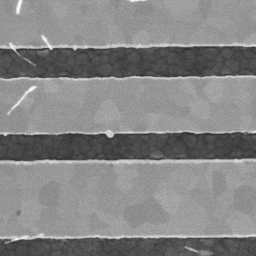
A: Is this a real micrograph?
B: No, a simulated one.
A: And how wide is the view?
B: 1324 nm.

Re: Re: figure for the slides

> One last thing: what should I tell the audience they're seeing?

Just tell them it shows lines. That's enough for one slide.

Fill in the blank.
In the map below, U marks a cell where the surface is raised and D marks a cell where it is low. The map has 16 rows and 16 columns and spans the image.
UUUUUUUUUUUUUUUU
UUUUUUUUUUUUUUUU
UUUUUUUUUUUUUUUU
DDDDDDDDDDDDDDDD
DDDDDDDDDDDDDDDD
UUUUUUUUUUUUUUUU
UUUUUUUUUUUUUUUU
UUUUUUUUUUUUUUUU
DDDDDDDDDDDDDDDD
DDDDDDDDDDDDDDDD
UUUUUUUUUUUUUUUU
UUUUUUUUUUUUUUUU
UUUUUUUUUUUUUUUU
UUUUUUUUUUUUUUUU
UUUUUUUUUUUUUUUU
DDDDDDDDDDDDDDDD